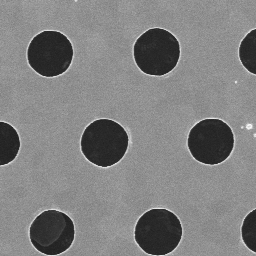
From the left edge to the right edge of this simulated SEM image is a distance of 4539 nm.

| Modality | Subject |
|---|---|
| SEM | holes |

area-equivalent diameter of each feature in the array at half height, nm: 820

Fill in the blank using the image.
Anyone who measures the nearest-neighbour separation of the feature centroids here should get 1850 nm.